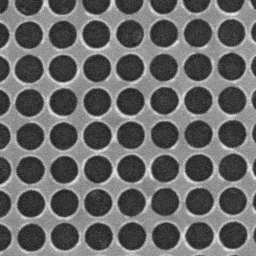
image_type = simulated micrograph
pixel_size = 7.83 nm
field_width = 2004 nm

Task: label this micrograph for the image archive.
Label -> a regular array of holes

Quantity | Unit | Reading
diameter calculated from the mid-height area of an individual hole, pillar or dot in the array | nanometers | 226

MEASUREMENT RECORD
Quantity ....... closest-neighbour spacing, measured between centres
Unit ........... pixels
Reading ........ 33.4